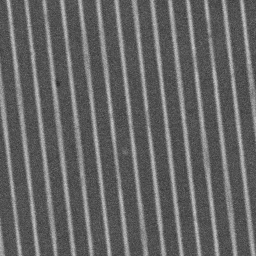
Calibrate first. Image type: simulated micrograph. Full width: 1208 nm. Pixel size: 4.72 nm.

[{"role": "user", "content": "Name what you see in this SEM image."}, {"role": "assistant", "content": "parallel lines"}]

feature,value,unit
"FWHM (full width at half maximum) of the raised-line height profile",9.4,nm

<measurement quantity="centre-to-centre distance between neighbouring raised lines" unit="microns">0.0841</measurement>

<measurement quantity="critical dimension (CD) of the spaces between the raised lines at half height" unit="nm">75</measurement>